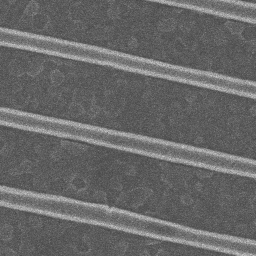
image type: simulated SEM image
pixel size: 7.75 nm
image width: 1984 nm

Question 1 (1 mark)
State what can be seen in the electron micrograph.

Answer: one or a few lines or trenches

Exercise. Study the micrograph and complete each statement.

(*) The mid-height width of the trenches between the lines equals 0.493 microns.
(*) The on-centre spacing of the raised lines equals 604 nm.